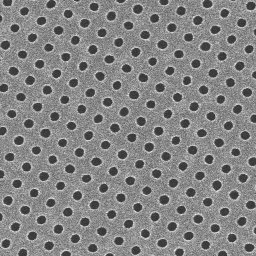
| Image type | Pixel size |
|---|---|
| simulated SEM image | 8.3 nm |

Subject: a regular array of holes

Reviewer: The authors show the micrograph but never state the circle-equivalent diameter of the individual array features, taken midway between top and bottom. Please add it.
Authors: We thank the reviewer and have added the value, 73.8 nm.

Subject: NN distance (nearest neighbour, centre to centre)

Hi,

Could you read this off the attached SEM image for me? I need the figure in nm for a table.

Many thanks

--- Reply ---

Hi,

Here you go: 158